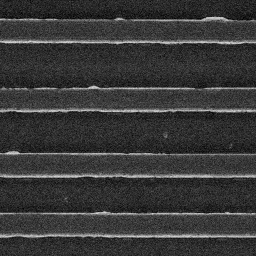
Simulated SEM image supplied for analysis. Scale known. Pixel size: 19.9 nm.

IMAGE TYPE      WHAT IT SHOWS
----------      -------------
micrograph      lines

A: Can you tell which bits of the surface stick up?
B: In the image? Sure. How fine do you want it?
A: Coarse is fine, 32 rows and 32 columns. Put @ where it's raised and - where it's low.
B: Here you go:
--------------------------------
--------------------------------
@@@@@@@@-----------------@@@----
@@@@@@@@@@@@@@@@@@@@@@@@@@@@@@@@
@@@@@@@@@@@@@@@@@@@@@@@@@@@@@@@@
--------------------------------
--------------------------------
--------------------------------
--------------------------------
--------------------------------
--------------------------------
@@@@@@@@@@@@@@@@@@@@@@@@@@@@@@@@
@@@@@@@@@@@@@@@@@@@@@@@@@@@@@@@@
@@@@@@@@@@@@@@@@@@@@@@@@@@@@@@@@
--------------------------------
--------------------------------
--------------------------------
--------------------------------
--------------------------------
@@@@@@@@@@@@@@@@@@@@@@@@@@@@@@@@
@@@@@@@@@@@@@@@@@@@@@@@@@@@@@@@@
@@@@@@@@@@@@@@@@@@@@@@@@@@@@@@@@
--------------------------------
--------------------------------
--------------------------------
--------------------------------
--------------------------------
@@@@@@@@@@@@@@@@@@@@@@@@@@@@@@@@
@@@@@@@@@@@@@@@@@@@@@@@@@@@@@@@@
@@--@--------@@@@@@@@@@-@@@@@@@@
--------------------------------
--------------------------------